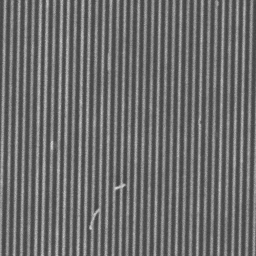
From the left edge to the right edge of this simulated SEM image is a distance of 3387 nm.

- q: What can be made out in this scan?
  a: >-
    parallel lines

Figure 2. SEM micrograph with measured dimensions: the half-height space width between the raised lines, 61.2 nm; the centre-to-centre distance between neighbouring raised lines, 93.2 nanometres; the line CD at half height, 2.75 px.